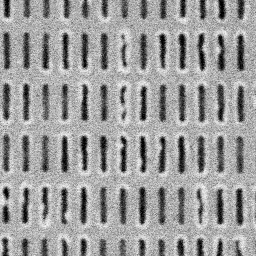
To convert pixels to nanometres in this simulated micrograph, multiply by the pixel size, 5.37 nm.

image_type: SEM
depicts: a regular array of holes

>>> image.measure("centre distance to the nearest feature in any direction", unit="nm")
103